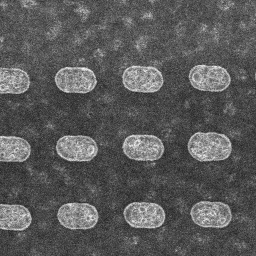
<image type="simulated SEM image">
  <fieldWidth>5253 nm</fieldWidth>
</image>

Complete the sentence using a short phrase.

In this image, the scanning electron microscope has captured a regular array of raised bodies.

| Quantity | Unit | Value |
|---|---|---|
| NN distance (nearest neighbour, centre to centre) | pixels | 66.5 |